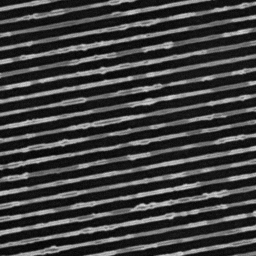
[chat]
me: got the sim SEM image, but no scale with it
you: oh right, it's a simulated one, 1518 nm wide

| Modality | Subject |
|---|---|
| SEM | parallel lines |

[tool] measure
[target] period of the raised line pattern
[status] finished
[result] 76.9 nm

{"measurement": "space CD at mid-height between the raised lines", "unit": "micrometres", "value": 0.0533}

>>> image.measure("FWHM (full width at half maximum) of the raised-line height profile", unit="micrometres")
0.0211